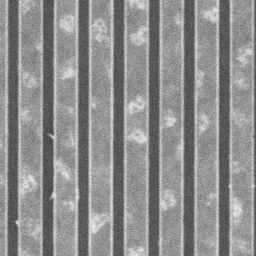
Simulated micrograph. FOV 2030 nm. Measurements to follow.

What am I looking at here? parallel lines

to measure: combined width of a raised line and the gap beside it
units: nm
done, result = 279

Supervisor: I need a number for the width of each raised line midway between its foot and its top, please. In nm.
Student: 180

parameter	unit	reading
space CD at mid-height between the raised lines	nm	97.1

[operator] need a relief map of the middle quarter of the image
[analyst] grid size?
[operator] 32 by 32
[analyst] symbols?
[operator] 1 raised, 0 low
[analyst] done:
11100001111100011111100011111100
11100001111100011111100011111100
11100001111100011111100011111100
11100001111100011111100011111100
11100001111100011111100011111100
11100001111100011111100011111100
11100001111100011111100011111100
11100001111100011111100011111100
11100001111100011111100011111100
11100001111100011111100011111100
11100001111100011111100011111100
11100001111100011111100011111100
11100001111100011111100011111100
11100001111100011111100011111100
11100001111100011111100011111100
11100001111100011111100011111100
11100001111100011111100011111100
11100001111100011111100011111100
11100001111100011111100011111100
11100001111100011111100011111100
11100001111100011111100011111100
11100011111100011111100011111100
11100011111100011111100011111100
11100011111100011111100011111100
11100011111100011111100011111100
11100011111100011111100011111100
11100011111100011111100011111100
11100011111100011111100011111100
11100011111100011111100011111100
11100011111100011111100011111100
11100011111100011111100011111100
11100011111100011111100011111100